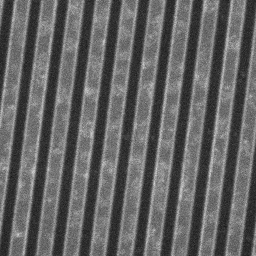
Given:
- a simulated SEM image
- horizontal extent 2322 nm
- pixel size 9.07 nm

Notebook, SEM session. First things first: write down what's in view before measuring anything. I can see parallel lines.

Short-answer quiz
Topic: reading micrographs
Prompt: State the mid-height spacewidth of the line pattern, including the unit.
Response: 107 nm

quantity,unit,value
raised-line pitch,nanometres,243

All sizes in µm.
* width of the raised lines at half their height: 0.13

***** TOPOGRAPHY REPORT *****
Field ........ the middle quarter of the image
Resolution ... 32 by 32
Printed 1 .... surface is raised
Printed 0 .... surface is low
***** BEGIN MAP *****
11100011100001110000111000111100
11100011100011110001111000111100
11000011100011110001111000111100
11000011100011110001111000111000
11000111100011110001111000111000
11000111100011110001110000111000
11000111100011100001110001111000
11000111100011100001110001111000
11000111000011100001110001111000
11000111000011100011110001111000
10000111000111100011110001111000
10000111000111100011110001110000
10001111000111100011110001110000
10001111000111100011100011110001
10001111000111000011100011110001
10001111000111000011100011110001
10001110000111000011100011110001
00001110001111000111100011110001
00001110001111000111100011110001
00001110001111000111100011100001
00011110001111000111000011100011
00011110001111000111000111100011
00011110001110000111000111100011
00011110001110000111000111100011
00011100001110001111000111100011
00011100001110001111000111100011
00011100011110001111000111100011
00011100011110001111000111000111
00111100011110001110000111000111
00111100011110001110001111000111
00111100011100001110001111000111
00111000011100001110001111000111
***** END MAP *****